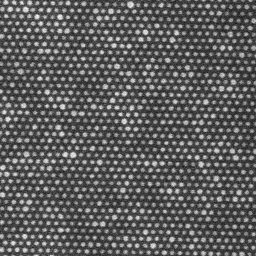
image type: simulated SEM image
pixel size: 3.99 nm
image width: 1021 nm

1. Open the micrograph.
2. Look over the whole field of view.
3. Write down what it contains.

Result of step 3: a regular array of raised bodies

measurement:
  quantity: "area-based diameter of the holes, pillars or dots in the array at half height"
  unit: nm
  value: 14.2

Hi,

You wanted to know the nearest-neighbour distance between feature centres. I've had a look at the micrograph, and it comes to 30 nm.